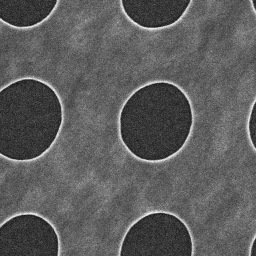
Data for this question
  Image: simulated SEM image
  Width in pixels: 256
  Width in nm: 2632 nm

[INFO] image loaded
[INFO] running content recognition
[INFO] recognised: holes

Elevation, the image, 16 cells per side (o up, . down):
...ooooo....oooo
o.ooooooo..ooooo
oooooooooooooooo
oooooooooooooooo
oooooooooooooooo
...oooooo..ooooo
....oooo....oooo
....oooo....oooo
...ooooo....oooo
...ooooo...ooooo
oooooooooooooooo
oooooooooooooooo
oooooooooooooooo
o.ooooooo..ooooo
...ooooo....oooo
....oooo....oooo